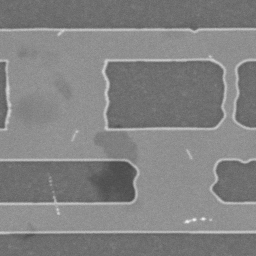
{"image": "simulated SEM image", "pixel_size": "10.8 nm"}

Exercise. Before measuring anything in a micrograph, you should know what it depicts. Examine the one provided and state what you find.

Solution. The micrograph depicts one or a few lines or trenches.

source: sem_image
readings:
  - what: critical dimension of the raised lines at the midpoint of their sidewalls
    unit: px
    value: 30.1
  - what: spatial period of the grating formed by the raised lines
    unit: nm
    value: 918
